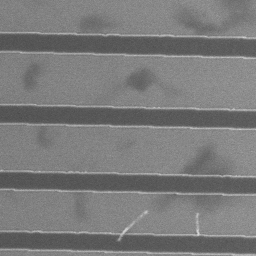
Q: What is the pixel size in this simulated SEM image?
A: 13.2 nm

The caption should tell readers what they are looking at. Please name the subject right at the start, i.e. lines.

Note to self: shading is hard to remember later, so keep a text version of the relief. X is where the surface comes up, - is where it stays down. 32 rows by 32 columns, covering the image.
--------------------------------
--------------------------------
--------------------------------
--------------------------------
XXXXXXXXXXXXXXXXXXXXXX----------
XXXXXXXXXXXXXXXXXXXXXXXXXXXXXXXX
--XXXXXXXXXXXXXXXXXXXXXXXXXXXXXX
--------------------------------
--------------------------------
--------------------------------
--------------------------------
--------------------------------
--------------------------------
XXXXXXXXXXXXXXXXXXXX------------
XXXXXXXXXXXXXXXXXXXXXXXXXXXXXXXX
---XXXXXXXXXXXXXXXXXXXXXXXXXXXXX
--------------------------------
--------------------------------
--------------------------------
--------------------------------
--------------------------------
XXXXX---------------------------
XXXXXXXXXXXXXXXXXXXXXXXXXXXXXXXX
XXXXXXXXXXXXXXXXXXXXXXXXXXXXXXXX
--------------------------------
--------------------------------
--------------------------------
--------------------------------
--------------------------------
XXXXXXXXXXXXXXXXXXXXXXXXXXXXXXX-
XXXXXXXXXXXXXXXXXXXXXXXXXXXXXXXX
-------------XXXXXXXXXXXXXXXXXXX